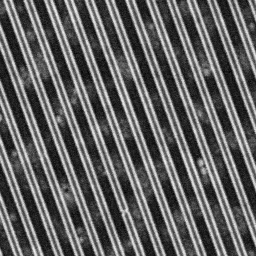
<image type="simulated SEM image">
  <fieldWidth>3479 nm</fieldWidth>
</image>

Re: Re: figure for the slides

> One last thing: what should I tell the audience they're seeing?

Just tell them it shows parallel lines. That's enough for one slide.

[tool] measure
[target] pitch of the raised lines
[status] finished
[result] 261 nanometres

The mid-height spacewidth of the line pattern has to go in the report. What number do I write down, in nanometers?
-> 182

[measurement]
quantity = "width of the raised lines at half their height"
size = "0.0798 microns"